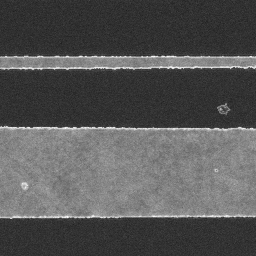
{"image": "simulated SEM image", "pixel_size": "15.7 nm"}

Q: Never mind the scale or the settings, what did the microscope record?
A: lines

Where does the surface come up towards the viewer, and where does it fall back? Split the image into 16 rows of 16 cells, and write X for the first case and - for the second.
----------------
----------------
----------------
----------------
----------------
----------------
----------------
----------------
XXXXXXXXXXXXXXXX
XXXXXXXXXXXXXXXX
XXXXXXXXXXXXXXXX
XXXXXXXXXXXXXXXX
XXXXXXXXXXXXXXXX
XXXXXXXXXXXXXXX-
----------------
----------------